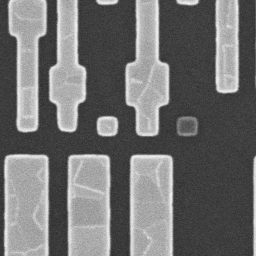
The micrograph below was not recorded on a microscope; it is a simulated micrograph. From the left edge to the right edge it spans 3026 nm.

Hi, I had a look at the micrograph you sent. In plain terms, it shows wiring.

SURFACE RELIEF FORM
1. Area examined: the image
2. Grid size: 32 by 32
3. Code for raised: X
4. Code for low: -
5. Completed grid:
-XXXXX-XXX-------XXX-------XXX--
-XXXXX-XXX-------XXX-------XXX--
-XXXXX-XXX-------XXX-------XXX--
-XXXXX-XXX-------XXX-------XXX--
--XXX--XXX-------XXX-------XXX--
--XXX--XXX-------XXX-------XXX--
--XXX--XXX-------XXX-------XXX--
--XXX--XXX-------XXX-------XXX--
--XXX--XXX------XXXXX------XXX--
--XXX-XXXXX-----XXXXX------XXX--
--XXX-XXXXX-----XXXXX------XXX--
--XXX-XXXXX-----XXXXX-----------
--XXX--XXX------XXXXX-----------
--XXX--XXX-------XXX------------
--XXX--XXX-------XXX------------
--XXX--XX---XXX--XXX--XX--------
------------XX---XXX--XX--------
--------------------------------
--------------------------------
-XXXX-----XXX----X-X------------
-XXXXX---XXXX----XXXX-----------
-XXXXX---XXXXX---XXXX-----------
-XXXXX---XXXXX--XXXXX-----------
-XXXXX---XXXXX---XXXX-----------
-XXXXX---XXXX----XXXX-----------
-XXXXX---XXXXX---XXXX-----------
-XXXXX---XXXXX---XXXX-----------
-XXXXX---XXXXX---XXXX-----------
-XXXXX---XXXXX---XXXX-----------
-XXXXX---XXXXX---XXXX-----------
-XXXXX---XXXXX---XXXX-----------
-XXXXX---XXXXX---XXXX-----------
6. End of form